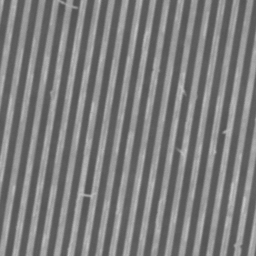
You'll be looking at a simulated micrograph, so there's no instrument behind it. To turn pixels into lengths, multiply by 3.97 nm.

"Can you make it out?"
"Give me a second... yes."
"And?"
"parallel lines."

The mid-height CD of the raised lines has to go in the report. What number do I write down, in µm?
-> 0.0245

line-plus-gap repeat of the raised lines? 54.4 nm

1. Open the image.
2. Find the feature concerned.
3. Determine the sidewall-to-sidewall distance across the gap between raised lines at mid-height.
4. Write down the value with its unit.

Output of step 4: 7.03 pixels